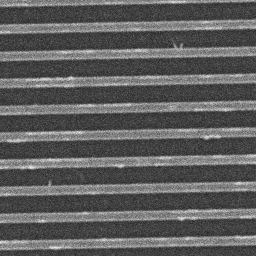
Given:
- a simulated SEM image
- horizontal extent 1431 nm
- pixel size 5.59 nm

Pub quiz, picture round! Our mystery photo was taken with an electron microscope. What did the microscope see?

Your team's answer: parallel lines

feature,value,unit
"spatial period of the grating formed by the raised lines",151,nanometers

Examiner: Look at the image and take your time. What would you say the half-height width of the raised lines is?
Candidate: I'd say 45.4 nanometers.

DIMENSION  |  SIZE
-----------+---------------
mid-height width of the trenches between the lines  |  0.105 µm